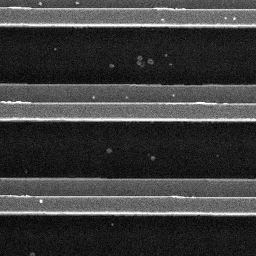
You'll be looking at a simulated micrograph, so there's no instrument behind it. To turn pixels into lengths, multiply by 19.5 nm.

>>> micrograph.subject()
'lines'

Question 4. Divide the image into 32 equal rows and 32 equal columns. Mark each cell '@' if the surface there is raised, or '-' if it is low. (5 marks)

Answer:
@@@@@@@@@@@@@@@@@@@@@@@@@@@@@@@@
@@@@@@@@@@@@@@@@@@@@@@@@@@@@@@@@
@@@@@@@@@@@@@@@@@@@@@@@@@@@@@@@@
--------------------------------
--------------------------------
--------------------------------
--------------------------------
--------------------------------
--------------------------------
--------------------------------
--------------------------------
@@@@@@@@@@@@@@@@@@@@@@@@@@@@@@@@
@@@@@@@@@@@@@@@@@@@@@@@@@@@@@@@@
@@@@@@@@@@@@@@@@@@@@@@@@@@@@@@@@
@@@@@@@@@@@@@@@@@@@@@@@@@@@@@@@@
--------------------------------
--------------------------------
--------------------------------
--------------------------------
--------------------------------
--------------------------------
--------------------------------
@@@@@@@@@@@@@@@@@@@@@@@@@@@-----
@@@@@@@@@@@@@@@@@@@@@@@@@@@@@@@@
@@@@@@@@@@@@@@@@@@@@@@@@@@@@@@@@
@@@@@@@@@@@@@@@@@@@@@@@@@@@@@@@@
@@@@@@@@@@@@@@@@@@@@@@@@@@@@@@@@
--------------------------------
--------------------------------
--------------------------------
--------------------------------
--------------------------------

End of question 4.